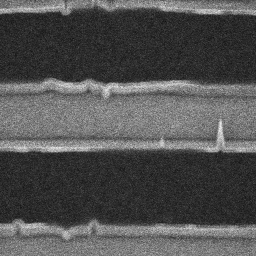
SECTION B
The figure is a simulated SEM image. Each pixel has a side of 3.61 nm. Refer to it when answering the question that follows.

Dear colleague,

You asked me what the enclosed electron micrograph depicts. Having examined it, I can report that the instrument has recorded one or a few lines or trenches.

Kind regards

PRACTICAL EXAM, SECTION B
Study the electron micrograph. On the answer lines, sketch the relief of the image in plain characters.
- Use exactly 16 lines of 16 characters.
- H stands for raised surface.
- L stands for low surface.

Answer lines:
HHHHHHHHHHHHHHHH
HHHHHHHHHHHHHHHH
HHHHHHHHHHHHHHHH
HHHHHHHHHHHHHHHH
HHHHHHHHHHHHHHHH
HLLLHHHHHHLHHHHH
LLLLLLLLLLLLLLLL
LLLLLLLLLLLLLLLL
LLLLLLLLLLLLLLLL
HHHHHHHHHHHHHHHH
HHHHHHHHHHHHHHHH
HHHHHHHHHHHHHHHH
HHHHHHHHHHHHHHHH
HHHHHHHHHHHHHHHH
LLLLHLLLLLLLHHHH
LLLLLLLLLLLLLLLL